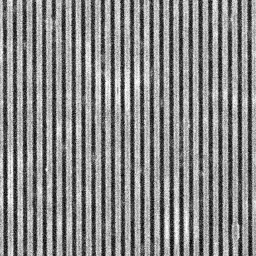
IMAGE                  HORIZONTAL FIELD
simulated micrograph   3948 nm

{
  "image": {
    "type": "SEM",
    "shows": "parallel lines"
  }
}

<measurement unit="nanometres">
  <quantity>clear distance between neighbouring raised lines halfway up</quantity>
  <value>79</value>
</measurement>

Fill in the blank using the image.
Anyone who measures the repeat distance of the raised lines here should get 151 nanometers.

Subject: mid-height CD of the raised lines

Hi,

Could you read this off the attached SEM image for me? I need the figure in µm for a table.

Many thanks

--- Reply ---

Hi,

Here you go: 0.0713